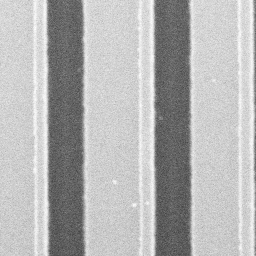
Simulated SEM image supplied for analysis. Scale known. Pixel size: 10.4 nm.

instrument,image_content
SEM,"lines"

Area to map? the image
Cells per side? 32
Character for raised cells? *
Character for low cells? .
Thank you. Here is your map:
******.....********.....********
******.....********.....********
******.....********.....********
******.....********.....********
******.....********.....********
******.....********.....********
******.....********.....********
******.....********.....********
******.....********.....********
******.....********.....********
******.....********.....********
******.....********.....********
******.....********.....********
******.....********.....********
******.....********.....********
******.....********.....********
******.....********.....********
******.....********.....********
******.....********.....********
******.....********.....********
******.....********.....********
******.....********.....********
******.....********.....********
******.....********.....********
******.....********.....********
******.....********.....********
******.....********.....********
******.....********.....********
******.....********.....********
******.....********.....********
******.....********.....********
******.....********.....********